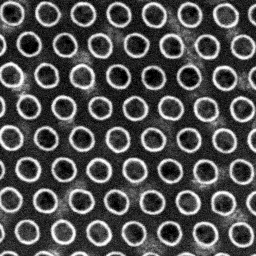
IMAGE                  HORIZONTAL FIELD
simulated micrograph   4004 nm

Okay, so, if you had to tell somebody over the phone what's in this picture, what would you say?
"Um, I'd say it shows a regular array of raised bodies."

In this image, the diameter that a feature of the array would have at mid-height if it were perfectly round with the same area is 0.35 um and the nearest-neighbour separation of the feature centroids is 553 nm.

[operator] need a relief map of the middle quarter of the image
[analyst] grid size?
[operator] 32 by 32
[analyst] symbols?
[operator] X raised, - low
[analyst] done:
----X--------X------------------
--XXXXX----XXXXX----XXXX-----XXX
--XXXXX----XXXXX----XXXXX----XXX
--XXXXX----XXXXX----XXXXX----XXX
--XXXXX----XXXXX----XXXXX----XXX
---XXX------XXX------XXX------XX
--------------------------------
--------------------------------
X----------------XX------XX-----
XX-----XXXX-----XXXX----XXXXX---
XXX----XXXXX---XXXXX----XXXXX---
XXX----XXXXX---XXXXXX---XXXXXX--
XX-----XXXXX---XXXXX----XXXXX---
--------XX-------XX-------XX----
--------------------------------
--------------------------------
---XXX------XXX------XX-------XX
--XXXXX----XXXXX----XXXX-----XXX
--XXXXX----XXXXX----XXXXX----XXX
--XXXXX----XXXXX----XXXXX----XXX
--XXXXX----XXXXX----XXXXX----XXX
-------------XX---------------XX
--------------------------------
--------------------------------
XX-----XXX------XXX------XXX----
XXX---XXXXX----XXXXX----XXXXX---
XXX---XXXXXX---XXXXX----XXXXX---
XXX---XXXXX----XXXXX----XXXXX---
XX-----XXXX-----XXXX-----XXXX---
--------------------------X-----
--------------------------------
--------------------------------